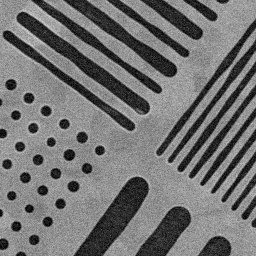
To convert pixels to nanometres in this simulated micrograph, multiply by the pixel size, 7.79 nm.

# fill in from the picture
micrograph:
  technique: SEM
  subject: groups of lines, slits or small figures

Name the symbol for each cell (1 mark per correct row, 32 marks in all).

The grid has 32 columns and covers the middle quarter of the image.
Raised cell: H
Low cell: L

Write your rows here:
HHHLLLLLLHHHHHLLLHHHHHLLLLLLHHHH
HHHHLLLLLLHHHHHLLLHHHHHLLLLLHHHH
LHHHHLLLLLLLHHHHLLLLHHHHLLLLHHHH
LLHHHHLLLLLLLHHHHHLLLLHHHHHHHHHH
LLLLHHHHLLLLLLHHHHHLLLLHHHHHHHHH
HLLLLHHHHLLLLLLLHHHHLLLLHHHHHHHH
HHHLLLHHHHHLLLLLLHHHHHLLLHHHHHHH
HHHHLLLLHHHHLLLLLLHHHHHHHHHHHHHH
HHHHHLLLLHHHHLLLLLLLHHHHHHHHHHHH
HHHHHHLLLLHHHHHLLLLLLHHHHHHHHHHH
HHHHHHHHLLLLHHHHLLLLLLHHHHHHHHHL
HHHHHHHHHLLLLHHHHLLLLHHHHHHHHHHL
HHHHHHHHHHHLLLLHHHHLLHHHHHHHHHLL
HHHHHHHHHHHHLLLLHHHHHHHHHHHHHLLH
LHHHHHHHHHHHHLLLLHHHHHHHHHHHLLLH
LHHHHHHHHHHHHHLLLLHHHHHHHHHLLLHH
HHHHHHHHHHHHHHHLLLHHHHHHHHHLLHHL
HHHLLLHHHHHHHHHHHHHHHHHHHHLLHHLL
HHHLLLHHHHHHHHHHHHHHHHHHHLLLHHLL
HHHLLLHHHHHHHHHHHHHHHHHHHLLHHLLH
HHHHHHHHLLHHHHHHHHHHHHHHLLHHLLHH
LLHHHHHHLLHHHHHHHHHHHHHLLLHLLLHL
LLLHHHHHLLHHHHHHHHHHHHHLLHHLLHHL
LLLHHHHHHHHHHHHHHHHHHHHHHHLLHHLL
HHHHHHHHHHHHHHHHHHHHHHHHHHLHHLLL
HHHHHLLHHHHHHHHHHHHHHHHHHHHHLLLH
HHHHLLLHHHHHHHHHHHHHHHHHHHHHLLHH
HHHHHHHHHHHHHHHHHHHHHHHHHHHHHHHL
HHHHHHHHHHHHHHHHHLLLHHHHHHHHHHHL
HLLHHHHHHHHHHHHLLLLLLHHHHHHHHHHH
HLLLHHHHHHHHHHHLLLLLLHHHHHHHHHHH
HLLLHHHHHHHHHHLLLLLLLHHHHHHHHHHH